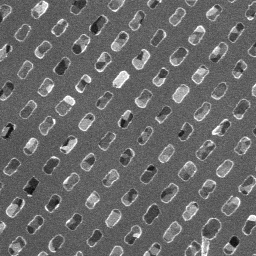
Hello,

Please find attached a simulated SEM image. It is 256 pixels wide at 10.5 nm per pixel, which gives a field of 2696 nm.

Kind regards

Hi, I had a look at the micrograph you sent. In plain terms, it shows a regular array of raised bodies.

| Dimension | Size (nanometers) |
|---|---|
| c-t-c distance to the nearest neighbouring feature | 279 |